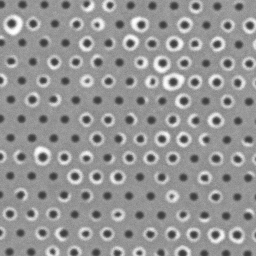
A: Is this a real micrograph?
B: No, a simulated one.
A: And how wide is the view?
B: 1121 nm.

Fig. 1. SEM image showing a regular array of holes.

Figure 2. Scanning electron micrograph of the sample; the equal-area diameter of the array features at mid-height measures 0.0356 um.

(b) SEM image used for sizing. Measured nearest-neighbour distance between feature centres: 94.2 nm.